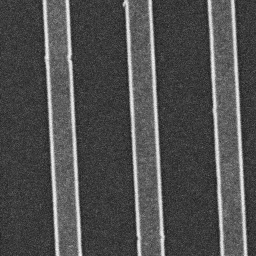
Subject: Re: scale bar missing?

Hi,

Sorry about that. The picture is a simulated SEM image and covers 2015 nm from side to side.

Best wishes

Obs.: one or a few lines or trenches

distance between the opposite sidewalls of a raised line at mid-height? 182 nm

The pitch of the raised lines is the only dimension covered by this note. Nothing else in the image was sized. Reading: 0.649 micrometres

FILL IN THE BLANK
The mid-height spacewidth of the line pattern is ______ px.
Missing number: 59.3